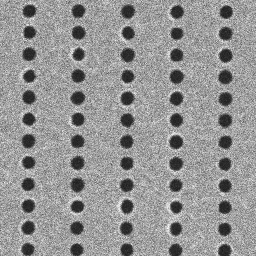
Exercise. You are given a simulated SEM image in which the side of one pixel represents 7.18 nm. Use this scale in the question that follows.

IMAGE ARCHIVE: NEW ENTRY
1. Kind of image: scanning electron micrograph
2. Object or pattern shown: a regular array of holes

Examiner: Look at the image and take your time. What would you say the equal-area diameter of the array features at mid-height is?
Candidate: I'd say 98.6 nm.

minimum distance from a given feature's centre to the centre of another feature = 0.155 µm